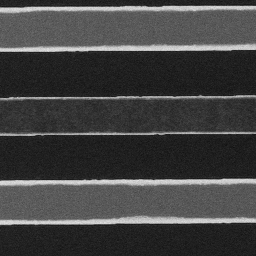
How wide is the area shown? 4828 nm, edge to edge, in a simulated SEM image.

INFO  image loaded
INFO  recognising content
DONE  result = lines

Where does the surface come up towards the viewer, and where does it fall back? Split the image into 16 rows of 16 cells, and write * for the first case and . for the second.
..........*.****
****************
****************
................
................
................
****************
****************
................
................
................
****************
****************
****************
................
................